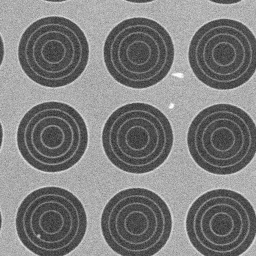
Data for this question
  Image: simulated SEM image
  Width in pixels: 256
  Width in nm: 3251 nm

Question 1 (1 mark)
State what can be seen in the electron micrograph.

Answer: an array of small figures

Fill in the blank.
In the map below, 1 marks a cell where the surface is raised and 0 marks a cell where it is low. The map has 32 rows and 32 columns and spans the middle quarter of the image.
01100011110001100000000110011110
11000111111001110000011100011111
10001111111000111111111000111111
00001111111100001111110001111111
00111111111110000000000011111111
11111111111111100000001111111111
11111111111111111111111111111111
11111111111111111111111111111111
11111111111111111111111111111111
11111111111111111101111111111111
00111111111111000000001111111111
00011111111110000000000011111111
10001111111100011111110001111111
11000111111000111101111000111111
11100111110001100000001100111111
01100011110011000000001100011110
00110011110011001111000110011110
00110011100011001111100110011110
00110011100010001111100010011110
00110011100010001111100110011110
00110011110011001111100110011110
01100011110011000000000110011110
11000111110001100000001100111110
10001111111000111101111000111111
00001111111100011111110001111111
00111111111110000000000011111111
01111111111111000000000111111111
11111111111111111100111111111111
11111111111111111111111111111111
11111111111111111111111111111111
11111111111111111111111111111111
01111111111111100000011111111111